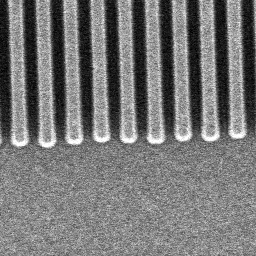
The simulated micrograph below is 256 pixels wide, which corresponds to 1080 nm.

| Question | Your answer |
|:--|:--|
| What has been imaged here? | parallel lines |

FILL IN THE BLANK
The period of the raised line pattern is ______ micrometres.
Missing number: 0.115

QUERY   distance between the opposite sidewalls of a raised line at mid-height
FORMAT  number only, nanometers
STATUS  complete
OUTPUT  61.7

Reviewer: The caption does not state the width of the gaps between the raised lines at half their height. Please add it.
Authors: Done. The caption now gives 54.3 nm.